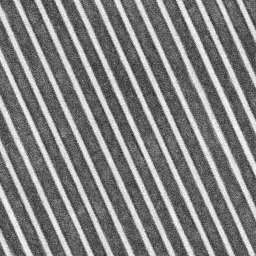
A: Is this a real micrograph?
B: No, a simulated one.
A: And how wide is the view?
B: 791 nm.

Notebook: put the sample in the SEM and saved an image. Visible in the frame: parallel lines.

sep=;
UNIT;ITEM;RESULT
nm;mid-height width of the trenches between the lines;43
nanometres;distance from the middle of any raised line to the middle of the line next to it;57.3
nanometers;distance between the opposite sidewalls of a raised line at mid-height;13.4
